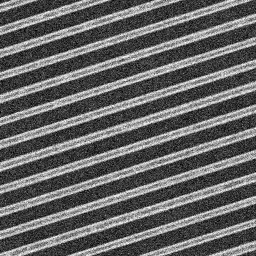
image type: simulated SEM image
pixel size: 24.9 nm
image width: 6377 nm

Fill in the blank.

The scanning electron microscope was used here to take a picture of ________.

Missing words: parallel lines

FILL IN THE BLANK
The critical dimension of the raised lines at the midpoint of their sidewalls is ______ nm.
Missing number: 131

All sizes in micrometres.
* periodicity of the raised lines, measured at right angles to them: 0.54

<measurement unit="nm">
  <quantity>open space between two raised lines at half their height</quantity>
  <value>406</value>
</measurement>